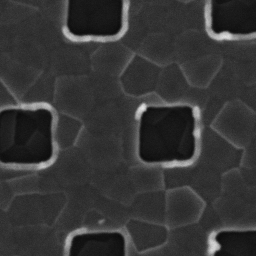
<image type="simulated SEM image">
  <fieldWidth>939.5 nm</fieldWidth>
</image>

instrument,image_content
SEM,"holes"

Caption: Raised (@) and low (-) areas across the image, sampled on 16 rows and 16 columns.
@@@@----@@@@@---
@@@@----@@@@@---
@@@@@@@@@@@@@@@@
@@@@@@@@@@@@@@@@
@@@@@@@@@@@@@@@@
@@@@@@@@@@@@@@@@
@@@@@@@@@@@@@@@@
---@@@@@@---@@@@
---@@@@@@---@@@@
---@@@@@@---@@@@
@@@@@@@@@@@@@@@@
@@@@@@@@@@@@@@@@
@@@@@@@@@@@@@@@@
@@@@@@@@@@@@@@@@
@@@@@@@@@@@@@@--
@@@@----@@@@@@--